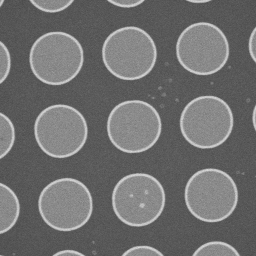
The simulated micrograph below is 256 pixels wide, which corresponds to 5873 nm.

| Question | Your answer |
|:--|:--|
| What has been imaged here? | an array of small figures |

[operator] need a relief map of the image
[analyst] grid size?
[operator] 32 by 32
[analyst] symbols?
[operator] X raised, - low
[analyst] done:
----XXXXX-----XXX---------------
------X-------------------------
--------------------------------
---------------XX------XXXX-----
-----XXXX-----XXXXX----XXXXX---X
----XXXXXX---XXXXXX---XXXXXX---X
X---XXXXXX---XXXXXX---XXXXXXX--X
X---XXXXXX---XXXXXX---XXXXXX----
X---XXXXXX---XXXXXX----XXXXX----
X---XXXXX-----XXXX--------------
------XX------------------------
--------------------------------
------------------------XXXX----
------XXX-----XXXXX----XXXXXX---
X----XXXXX----XXXXXX---XXXXXX---
X---XXXXXXX--XXXXXXX---XXXXXX---
XX--XXXXXXX--XXXXXXX---XXXXXX---
XX---XXXXXX---XXXXXX---XXXXX----
X----XXXXX-----XXXX------X------
X-----XXX-----------------------
--------------------------------
-------------------------XXX----
-------XX------XXXXX----XXXXX---
X-----XXXXX---XXXXXX---XXXXXXX--
XX---XXXXXX---XXXXXXX--XXXXXXX--
XX---XXXXXX---XXXXXXX--XXXXXXX--
XX---XXXXXX---XXXXXX----XXXXX---
XX---XXXXXX----XXXX------XXX----
X------XXX----------------------
--------------------------------
--------------------------XX----
-------XXX------XXXX----XXXXXX--